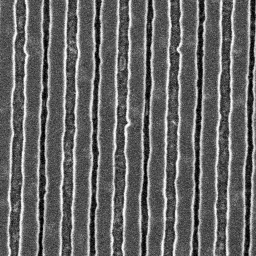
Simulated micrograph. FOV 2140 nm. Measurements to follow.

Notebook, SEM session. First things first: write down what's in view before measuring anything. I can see parallel lines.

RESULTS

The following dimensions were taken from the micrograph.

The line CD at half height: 17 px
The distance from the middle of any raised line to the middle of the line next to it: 216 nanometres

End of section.